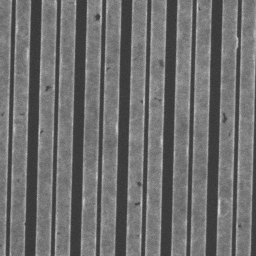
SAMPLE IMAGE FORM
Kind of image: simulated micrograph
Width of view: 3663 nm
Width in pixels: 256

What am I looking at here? parallel lines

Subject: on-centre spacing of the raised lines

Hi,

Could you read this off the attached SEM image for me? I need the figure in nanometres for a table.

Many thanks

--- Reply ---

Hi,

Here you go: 325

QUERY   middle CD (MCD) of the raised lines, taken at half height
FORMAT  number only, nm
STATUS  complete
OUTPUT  209